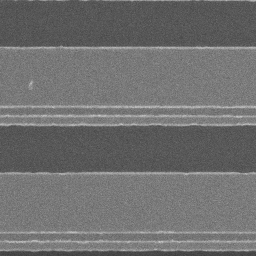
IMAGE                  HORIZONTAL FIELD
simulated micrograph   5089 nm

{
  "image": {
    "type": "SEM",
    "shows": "lines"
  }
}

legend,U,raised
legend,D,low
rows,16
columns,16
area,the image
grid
DDDDDDDDDDDDDDDD
DDDDDDDDDDDDDDDD
DDDDDDDDDDDDDDDD
UUUUUUUUUUUUUUUU
UUUUUUUUUUUUUUUU
UUUUUUUUUUUUUUUU
UUUUUUUUUUUUUUUU
UUUUUUUUUUUUUUUU
DDDDDDDDDDDDDDDD
DDDDDDDDDDDDDDDD
DDDDDDDDDDDDDDDD
UUUUUUUUUUUUUUUU
UUUUUUUUUUUUUUUU
UUUUUUUUUUUUUUUU
UUUUUUUUUUUUUUUU
UUUUUUUUUUUUUUUU